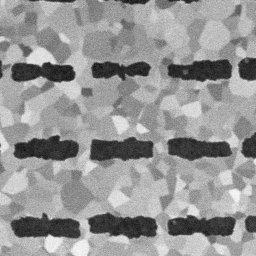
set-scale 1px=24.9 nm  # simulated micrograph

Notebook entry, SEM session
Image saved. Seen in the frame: a regular array of holes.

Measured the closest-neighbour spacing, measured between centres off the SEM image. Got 1910 nm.